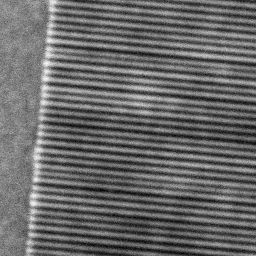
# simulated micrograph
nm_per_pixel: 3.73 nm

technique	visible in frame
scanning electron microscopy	parallel lines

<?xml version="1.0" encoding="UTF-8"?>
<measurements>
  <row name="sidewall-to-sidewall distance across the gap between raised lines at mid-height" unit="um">0.0139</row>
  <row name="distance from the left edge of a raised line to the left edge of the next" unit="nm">29.1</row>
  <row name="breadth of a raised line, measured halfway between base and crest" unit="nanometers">17.2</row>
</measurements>